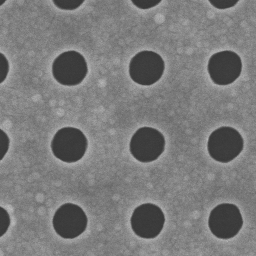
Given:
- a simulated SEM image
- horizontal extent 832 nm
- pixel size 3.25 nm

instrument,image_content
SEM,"a regular array of holes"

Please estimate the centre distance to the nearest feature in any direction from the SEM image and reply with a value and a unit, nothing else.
0.248 µm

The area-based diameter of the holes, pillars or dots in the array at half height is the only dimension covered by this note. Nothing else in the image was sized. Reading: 112 nanometers